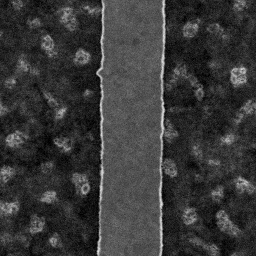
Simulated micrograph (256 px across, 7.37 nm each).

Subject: one or a few lines or trenches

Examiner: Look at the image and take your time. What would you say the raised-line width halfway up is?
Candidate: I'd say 450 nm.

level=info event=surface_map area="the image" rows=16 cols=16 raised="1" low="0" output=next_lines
0000001111000000
0000001111000000
0000001111000000
0000001111000000
0000001111000000
0000001111000000
0000001111000000
0000001111000000
0000001111000000
0000001111000000
0000001111000000
0000001111000000
0000001111000000
0000001111000000
0000001111000000
0000001111000000